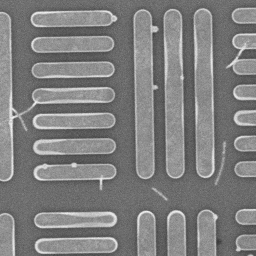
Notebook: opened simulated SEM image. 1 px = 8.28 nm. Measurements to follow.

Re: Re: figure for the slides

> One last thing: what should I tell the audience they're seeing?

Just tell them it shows groups of lines, slits or small figures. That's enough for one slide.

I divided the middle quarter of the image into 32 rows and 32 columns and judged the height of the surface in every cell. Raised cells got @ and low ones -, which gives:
@@@@@@@@@@@@------@@@@----@@@---
@@@@@@@@@@@@------@@@@---@@@@---
@@@@@@@@@@@@------@@@@---@@@@@--
------------------@@@@---@@@@@--
------------------@@@@---@@@@@--
------------------@@@@---@@@@@--
-@@@@@@@@@@@------@@@@---@@@@@--
@@@@@@@@@@@@@-----@@@@---@@@@@--
@@@@@@@@@@@@------@@@@---@@@@@--
------------------@@@@---@@@@@--
------------------@@@@---@@@@@--
------------------@@@@---@@@@@--
-------@@@@@------@@@@---@@@@@--
@@@@@@@@@@@@@-----@@@@---@@@@@--
@@@@@@@@@@@@@-----@@@@---@@@@@--
@@@@@@@@@@@@------@@@@---@@@@@--
------------------@@@@----@@@@--
------------------@@@@----@@@@--
------------------@@@@----@@@@--
@@@@@@@@@@@@------@@@@----@@@@--
@@@@@@@@@@@@@-----@@@@----@@@@--
@@@@@@@@@@@@------@@@@----@@@@--
------------------@@@@----@@@@--
------------------@@@@----@@@@--
------------------@@@@----@@@@--
@@@@@@@@@@@@------@@@@----@@@@--
@@@@@@@@@@@@@-----@@@@----@@@@--
@@@@@@@@@@@@@-----@@@@----@@@@--
@@@@@@@@@@@@--------@-----------
--------------------------------
--------------------------------
--------------------------------